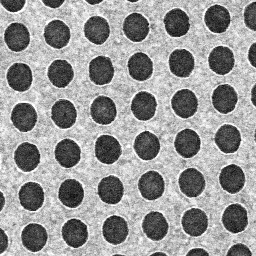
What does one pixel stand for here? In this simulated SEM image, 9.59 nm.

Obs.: a regular array of holes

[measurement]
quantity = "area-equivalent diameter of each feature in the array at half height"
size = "272 nanometers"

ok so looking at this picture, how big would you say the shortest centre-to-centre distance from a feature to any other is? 380 nanometers